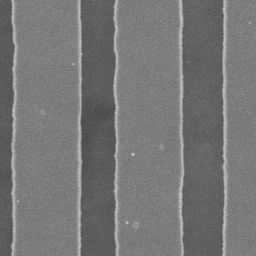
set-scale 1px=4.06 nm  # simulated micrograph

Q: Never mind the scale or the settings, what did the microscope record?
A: lines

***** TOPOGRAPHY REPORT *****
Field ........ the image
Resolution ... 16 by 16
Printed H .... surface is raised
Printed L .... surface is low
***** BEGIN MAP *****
LHHHHLLHHHHLLLHH
LHHHHLLHHHHLLLHH
LHHHHLLHHHHLLLHH
LHHHHLLHHHHLLLHH
LHHHHLLHHHHLLLHH
LHHHHLLHHHHLLLHH
LHHHHLLHHHHLLLHH
LHHHHLLHHHHLLLHH
LHHHHLLHHHHLLLHH
LHHHHLLHHHHLLLHH
LHHHHLLHHHHLLLHH
LHHHHLLHHHHLLLHH
LHHHHLLHHHHLLLHH
LHHHHLLHHHHLLLHH
LHHHHLLHHHHLLLHH
LHHHHLLHHHHLLLHH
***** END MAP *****